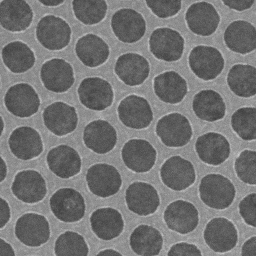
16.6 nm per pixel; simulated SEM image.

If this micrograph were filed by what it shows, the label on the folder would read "a regular array of holes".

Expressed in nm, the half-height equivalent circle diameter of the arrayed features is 583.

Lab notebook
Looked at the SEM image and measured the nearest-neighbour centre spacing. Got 709 nanometres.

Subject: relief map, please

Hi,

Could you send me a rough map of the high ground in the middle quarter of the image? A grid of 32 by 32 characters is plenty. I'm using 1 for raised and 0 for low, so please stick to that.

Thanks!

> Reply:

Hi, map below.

00111000011110000000011111111110
00111111111110000000011111111111
00111111111110000000011100000111
00011100001111000000011000000011
00010000000111100000110000000001
00110000000011111111110000000001
01100000000011111111111000000001
11100000000011111111111000000001
11110000000011100000111100000011
11110000000011000000011110000111
00111000000010000000001111111111
00011110001110000000001111111111
00011111111110000000001111000111
00001111111111000000001100000001
00011110000111000000001000000001
00011000000011100000011000000000
00011000000001111111111000000000
01111000000001111111111000000000
11111000000001111111111100000000
11111000000001100000011100000001
01111000000001100000001111000011
00011110000011000000000111111111
00001111101111000000000111111111
00001111111111100000000111000011
00001111111111100000000110000000
00001110000011110000001100000000
00001100000001111000001100000000
00011100000000111111111100000000
01111000000000111111111100000000
11111100000000011000111110000000
11111100000000110000001111000000
00011100000000100000000111100011